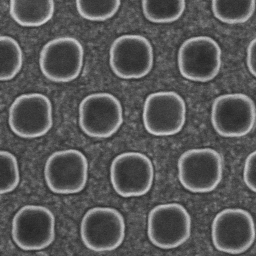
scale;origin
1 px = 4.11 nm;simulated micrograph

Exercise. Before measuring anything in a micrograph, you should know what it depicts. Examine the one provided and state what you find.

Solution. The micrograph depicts a regular array of raised bodies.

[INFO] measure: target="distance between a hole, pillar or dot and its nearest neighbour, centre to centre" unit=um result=0.264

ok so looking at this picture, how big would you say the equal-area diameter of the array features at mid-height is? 173 nanometres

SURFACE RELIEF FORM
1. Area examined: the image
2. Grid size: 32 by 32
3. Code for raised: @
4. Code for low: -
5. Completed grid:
-@@@@@@---@@@@@---@@@@@----@@@@@
-@@@@@----@@@@----@@@@@----@@@@-
--@@@@-------------@@-------@@--
--------------------------------
--------------------------------
@@----@@@@----@@@@@----@@@@----@
@@@--@@@@@----@@@@@----@@@@----@
@@@--@@@@@----@@@@@----@@@@----@
@@---@@@@@----@@@@@----@@@@----@
@@----@@@------@@@-----@@@@-----
--------------------------------
--------------------------------
--@@@@-----@@@----@@@@@----@@@@-
-@@@@@----@@@@@---@@@@@----@@@@@
-@@@@@----@@@@@---@@@@@----@@@@@
-@@@@@----@@@@@---@@@@@----@@@@-
--@@@@-----@@@-----@@@-----@@@@-
--------------------------------
--------------------------------
@------@@@-----@@@-----@@@@----@
@@----@@@@@---@@@@@----@@@@----@
@@----@@@@@---@@@@@----@@@@----@
@@----@@@@@---@@@@@----@@@@----@
@-----@@@@----@@@@@----@@@-----@
--------------------------------
--------------------------------
--@@@@-----@@@-----@@@@-----@@--
--@@@@@---@@@@@----@@@@----@@@@-
--@@@@@---@@@@@----@@@@----@@@@@
--@@@@@---@@@@@----@@@@----@@@@@
--@@@@-----@@@@-----@@-----@@@@-
--------------------------------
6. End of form